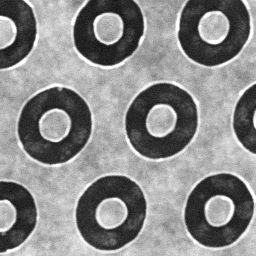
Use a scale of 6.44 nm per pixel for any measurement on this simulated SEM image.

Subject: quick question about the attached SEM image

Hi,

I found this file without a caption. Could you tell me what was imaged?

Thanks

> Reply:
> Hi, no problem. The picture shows ring-shaped grooves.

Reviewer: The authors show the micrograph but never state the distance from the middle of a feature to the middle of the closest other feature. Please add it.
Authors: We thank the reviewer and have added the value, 104 pixels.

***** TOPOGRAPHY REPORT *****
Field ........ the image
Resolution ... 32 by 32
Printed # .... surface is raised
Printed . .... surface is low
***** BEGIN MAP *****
....#######......######........#
....######........#####........#
#...#####...###...####...###...#
##...####...###...####...####..#
##...####...###...####...###...#
#...#####........#####.........#
....######.......######.......##
...########.....########.....###
.###############################
################################
###################...##########
#####....#########.....#######..
####.......######.......######..
###........#####...##....####...
##...###...#####..####...####...
##...####...####..####...####...
##...###...#####...##....####...
##....#....#####........######..
###.......#######......########.
####.....#########....##########
######..########################
################################
############.....########.....##
...########.......######.......#
....######........######........
#...######...##...#####...###...
##...####...####..#####...###...
##...#####..####..#####...###..#
#...######........#####........#
....######.......#######......##
...########.....#########....###
.###############################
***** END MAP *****